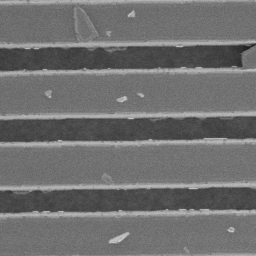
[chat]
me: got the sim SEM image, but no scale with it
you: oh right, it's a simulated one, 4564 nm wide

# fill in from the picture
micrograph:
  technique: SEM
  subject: lines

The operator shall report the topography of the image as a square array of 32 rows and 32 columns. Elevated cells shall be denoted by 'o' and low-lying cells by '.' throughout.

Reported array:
oooooooooooooooooooooooooooooooo
oooooooooooooooooooooooooooooooo
oooooooooooooooooooooooooooooooo
oooooooooooooooooooooooooooooooo
oooooooooooooooooooooooooooooooo
ooooooooooooooooooooooooooo....o
...............................o
..............................oo
..............................oo
oooooooooooooooooooooooooooooooo
oooooooooooooooooooooooooooooooo
oooooooooooooooooooooooooooooooo
oooooooooooooooooooooooooooooooo
oooooooooooooooooooooooooooooooo
oooooooooooooooooooooo..........
................................
................................
..............................oo
oooooooooooooooooooooooooooooooo
oooooooooooooooooooooooooooooooo
oooooooooooooooooooooooooooooooo
oooooooooooooooooooooooooooooooo
oooooooooooooooooooooooooooooooo
ooooooooooo.....................
................................
................................
...................ooooooooooooo
oooooooooooooooooooooooooooooooo
oooooooooooooooooooooooooooooooo
oooooooooooooooooooooooooooooooo
oooooooooooooooooooooooooooooooo
oooooooooooooooooooooooooooooooo